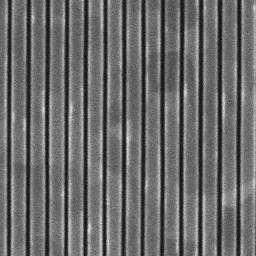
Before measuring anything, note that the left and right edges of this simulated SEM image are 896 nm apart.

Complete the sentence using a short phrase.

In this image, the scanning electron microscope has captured parallel lines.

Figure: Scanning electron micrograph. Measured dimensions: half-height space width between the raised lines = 17.9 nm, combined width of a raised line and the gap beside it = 66.9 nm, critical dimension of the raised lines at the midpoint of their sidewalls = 13.7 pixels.